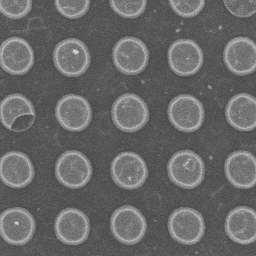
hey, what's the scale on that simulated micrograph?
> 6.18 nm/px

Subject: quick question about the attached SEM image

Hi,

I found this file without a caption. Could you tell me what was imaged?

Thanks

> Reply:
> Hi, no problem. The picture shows a regular array of raised bodies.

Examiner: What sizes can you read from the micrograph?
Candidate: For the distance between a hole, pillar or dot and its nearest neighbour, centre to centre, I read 343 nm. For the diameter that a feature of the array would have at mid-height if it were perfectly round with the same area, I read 213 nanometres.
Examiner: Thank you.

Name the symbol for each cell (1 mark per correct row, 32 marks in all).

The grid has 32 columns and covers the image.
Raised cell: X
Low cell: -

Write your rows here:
XXXX---XXXX---XXXX---XXXX-------
XXX----XXX-----XXX----XXX-------
--------------------------------
--------------------------------
--------------------------------
-XX-----XX-----XXX----XX-----XXX
XXXX---XXXX---XXXX---XXXX---XXXX
XXXX---XXXX---XXXX---XXXX---XXXX
-XXX---XXXX----XXX----XXX----XXX
--------------------------------
--------------------------------
--------------------------------
-XX-----XXX----XXX----XXX----XXX
XXXX---XXXX---XXXX---XXXX---XXXX
XXX----XXXX---XXXX---XXXX---XXXX
-X------XXX----XXX----XXX----XXX
--------------------------------
--------------------------------
--------------------------------
-XX-----XX-----XX-----XXX----XX-
XXXX---XXXX---XXXX---XXXX---XXXX
XXXX---XXXX---XXXX---XXXX---XXXX
XXXX---XXXX----XXX----XXX----XXX
--------------------------------
--------------------------------
--------------------------------
-XX-----XX-----XX-----XX-----XXX
XXXX---XXXX---XXXX---XXXX---XXXX
XXXX---XXXX---XXXX---XXXX---XXXX
XXXX---XXXX----XXX----XXX----XXX
--------------------------------
--------------------------------